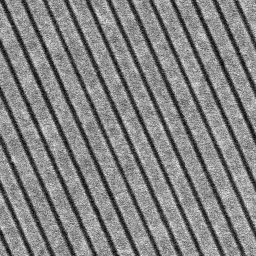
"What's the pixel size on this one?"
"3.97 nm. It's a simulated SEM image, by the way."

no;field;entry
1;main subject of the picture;parallel lines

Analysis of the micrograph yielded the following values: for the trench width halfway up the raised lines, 24.5 nanometers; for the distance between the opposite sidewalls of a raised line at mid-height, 0.0525 um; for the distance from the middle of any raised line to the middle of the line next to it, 77.1 nanometres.